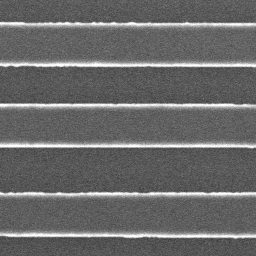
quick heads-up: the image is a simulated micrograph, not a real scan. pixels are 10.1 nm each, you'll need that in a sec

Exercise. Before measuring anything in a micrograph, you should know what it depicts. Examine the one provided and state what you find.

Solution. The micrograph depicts lines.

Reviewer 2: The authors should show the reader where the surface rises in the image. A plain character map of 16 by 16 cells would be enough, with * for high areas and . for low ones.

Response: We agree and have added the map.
................
****************
****************
****************
................
................
................
****************
****************
................
................
................
****************
****************
****************
................